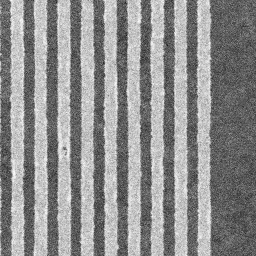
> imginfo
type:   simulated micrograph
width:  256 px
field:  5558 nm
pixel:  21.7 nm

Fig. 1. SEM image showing parallel lines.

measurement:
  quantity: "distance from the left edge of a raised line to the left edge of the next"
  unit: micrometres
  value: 0.506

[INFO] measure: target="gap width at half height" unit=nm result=261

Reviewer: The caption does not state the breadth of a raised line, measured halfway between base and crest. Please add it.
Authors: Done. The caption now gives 247 nanometres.